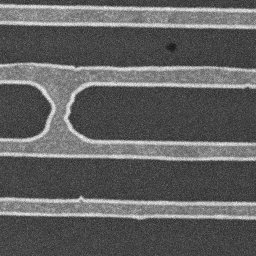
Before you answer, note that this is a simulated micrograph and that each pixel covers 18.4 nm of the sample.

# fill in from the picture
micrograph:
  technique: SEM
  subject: one or a few lines or trenches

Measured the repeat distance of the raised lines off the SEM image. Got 1180 nanometers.